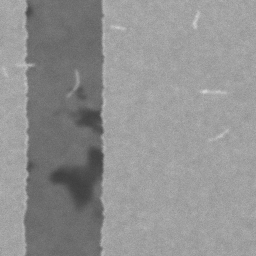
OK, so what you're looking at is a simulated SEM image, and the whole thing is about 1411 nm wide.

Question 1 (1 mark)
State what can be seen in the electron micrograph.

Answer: one or a few lines or trenches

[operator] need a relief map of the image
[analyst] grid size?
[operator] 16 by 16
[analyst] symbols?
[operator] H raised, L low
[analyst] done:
HHLLLLHHHHHHHHHH
HHLLLLHHHHHHHHHH
HHLLLLHHHHHHHHHH
HHLLLLHHHHHHHHHH
HHLLLLHHHHHHHHHH
HHLLLLHHHHHHHHHH
HHLLLLHHHHHHHHHH
HHLLLLHHHHHHHHHH
HHLLLLHHHHHHHHHH
HHLLLLHHHHHHHHHH
HHLLLLHHHHHHHHHH
HHLLLLHHHHHHHHHH
HHLLLLHHHHHHHHHH
HHLLLLLHHHHHHHHH
HHLLLLHHHHHHHHHH
HHLLLLHHHHHHHHHH